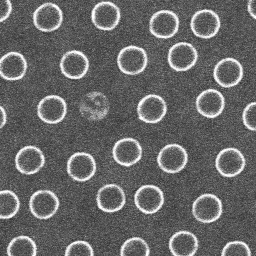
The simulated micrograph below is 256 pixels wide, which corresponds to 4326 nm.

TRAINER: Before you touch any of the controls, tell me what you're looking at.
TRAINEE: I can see a regular array of raised bodies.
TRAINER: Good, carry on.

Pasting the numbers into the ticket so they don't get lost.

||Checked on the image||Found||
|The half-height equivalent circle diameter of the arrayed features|461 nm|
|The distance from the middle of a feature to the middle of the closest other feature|777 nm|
